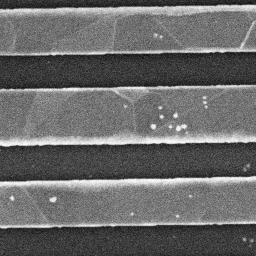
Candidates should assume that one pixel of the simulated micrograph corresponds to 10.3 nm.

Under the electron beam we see lines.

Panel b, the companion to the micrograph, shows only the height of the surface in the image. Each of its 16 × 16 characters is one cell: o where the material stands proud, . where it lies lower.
............oooo
oooooooooooooooo
oooooooooooooooo
................
................
.......ooooooooo
oooooooooooooooo
oooooooooooooooo
oooooooooooooooo
................
................
oooooooooooooooo
oooooooooooooooo
oooooooooooooooo
................
................